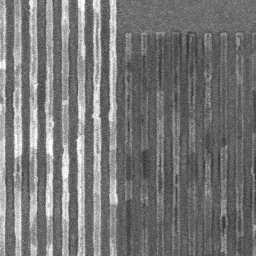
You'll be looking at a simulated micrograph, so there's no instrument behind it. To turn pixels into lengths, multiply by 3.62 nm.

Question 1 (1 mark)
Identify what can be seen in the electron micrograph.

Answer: parallel lines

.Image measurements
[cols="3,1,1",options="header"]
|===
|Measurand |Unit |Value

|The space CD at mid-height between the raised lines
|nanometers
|35.7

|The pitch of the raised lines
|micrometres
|0.0574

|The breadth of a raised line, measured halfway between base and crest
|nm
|22.6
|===